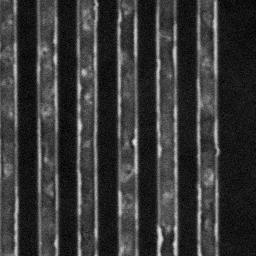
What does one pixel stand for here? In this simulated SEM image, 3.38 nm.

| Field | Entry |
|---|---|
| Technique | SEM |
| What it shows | parallel lines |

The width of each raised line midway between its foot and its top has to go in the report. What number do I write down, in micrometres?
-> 0.085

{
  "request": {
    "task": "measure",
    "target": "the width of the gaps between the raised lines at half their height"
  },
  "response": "51.6 nm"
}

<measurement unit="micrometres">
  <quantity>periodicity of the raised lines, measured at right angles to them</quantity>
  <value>0.135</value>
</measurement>